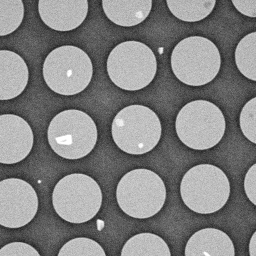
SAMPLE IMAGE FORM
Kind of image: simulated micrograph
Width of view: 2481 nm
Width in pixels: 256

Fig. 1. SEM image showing an array of small figures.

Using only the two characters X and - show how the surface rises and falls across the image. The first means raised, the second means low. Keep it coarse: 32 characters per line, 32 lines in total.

XXX--XXXXXX--XXXXXX--XXXXXX--XXX
XXX--XXXXXX--XXXXXX--XXXXX----XX
XXX--XXXXX----XXXX-----XX-------
XX-----XX-----------------------
-------------------------------X
---------------XXX----XXXXX---XX
X-----XXXX----XXXXX---XXXXX--XXX
XXX---XXXXX---XXXXX--XXXXXX--XXX
XXX--XXXXXX--XXXXXX---XXXXX---XX
XXX--XXXXXX---XXXXX---XXXXX----X
XXX---XXXXX---XXXX-----XX-------
XXX----XXX----------------------
-------------------------------X
----------------XX-----XXXX---XX
XX-----XXXX----XXXXX--XXXXXX--XX
XXX---XXXXXX--XXXXXX--XXXXXX--XX
XXXX--XXXXXX--XXXXXX--XXXXXX--XX
XXXX--XXXXXX--XXXXXX---XXXX----X
XXXX---XXXXX---XXXX-----XX------
XXX-----XX----------------------
--------------------------------
----------------XXX----XXXXX---X
-XX-----XXXX---XXXXX---XXXXX---X
XXXX---XXXXX---XXXXXX--XXXXXX--X
XXXXX--XXXXXX--XXXXXX--XXXXXX--X
XXXXX--XXXXXX--XXXXX---XXXXX----
XXXX---XXXXX----XXXX-----XX-----
XXXX----XXX---------------------
--------------------------------
-----------------XXX----XXXX----
-XX-----XXXX----XXXXX--XXXXXX--X
XXXXX--XXXXXX--XXXXXX--XXXXXX--X